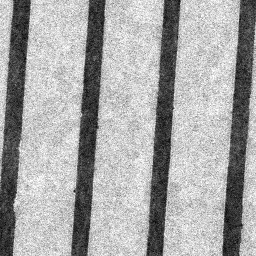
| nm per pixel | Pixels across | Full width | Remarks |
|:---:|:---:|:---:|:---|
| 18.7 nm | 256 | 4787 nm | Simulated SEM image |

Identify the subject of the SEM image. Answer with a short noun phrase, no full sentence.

one or a few lines or trenches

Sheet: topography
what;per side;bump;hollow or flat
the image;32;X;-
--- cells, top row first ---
XX--XXXXXXX--XXXXXXX---XXXXXXX--
X---XXXXXXX--XXXXXXX---XXXXXXX--
X---XXXXXXX--XXXXXXX--XXXXXXXX--
X---XXXXXXX--XXXXXXX--XXXXXXXX--
X---XXXXXXX--XXXXXXX-XXXXXXXXX--
X---XXXXXXX--XXXXXXXXXXXXXXXXX--
X--XXXXXXXX--XXXXXXX--XXXXXXXX--
X--XXXXXXXX--XXXXXXX--XXXXXXXX--
X--XXXXXXX---XXXXXXX--XXXXXXX---
X--XXXXXXX---XXXXXXX--XXXXXXX---
X--XXXXXXX---XXXXXXX--XXXXXXX--X
X--XXXXXXX---XXXXXXX--XXXXXXX--X
X--XXXXXXX--XXXXXXXX--XXXXXXX--X
X--XXXXXXX--XXXXXXXX--XXXXXXX--X
X--XXXXXXX--XXXXXXX---XXXXXXX--X
---XXXXXXX--XXXXXXX---XXXXXXX--X
---XXXXXXX--XXXXXXX---XXXXXXX--X
---XXXXXXX--XXXXXXX--XXXXXXXX--X
--XXXXXXXX--XXXXXXX--XXXXXXXX--X
---XXXXXXX--XXXXXXX--XXXXXXXX--X
--XXXXXXXX--XXXXXXX--XXXXXXX---X
--XXXXXXXX--XXXXXXX--XXXXXXX---X
--XXXXXXX---XXXXXXX--XXXXXXX---X
--XXXXXXX---XXXXXXX--XXXXXXX---X
--XXXXXXX---XXXXXXX--XXXXXXX--XX
--XXXXXXX---XXXXXXX--XXXXXXX--XX
--XXXXXXX--XXXXXXXX--XXXXXXX--XX
--XXXXXXX--XXXXXXXX--XXXXXXX--XX
--XXXXXXX--XXXXXXX---XXXXXXX--XX
--XXXXXXX--XXXXXXX---XXXXXXX--XX
--XXXXXXX--XXXXXXX--XXXXXXXX--XX
--XXXXXXX--XXXXXXX--XXXXXXXX--XX